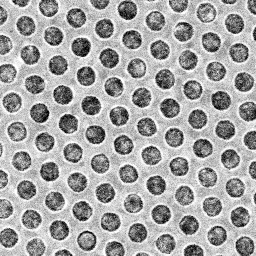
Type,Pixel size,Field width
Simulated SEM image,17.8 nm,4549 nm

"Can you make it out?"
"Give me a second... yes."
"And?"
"a regular array of holes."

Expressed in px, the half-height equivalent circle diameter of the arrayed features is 20.6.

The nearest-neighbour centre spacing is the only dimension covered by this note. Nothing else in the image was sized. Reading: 519 nm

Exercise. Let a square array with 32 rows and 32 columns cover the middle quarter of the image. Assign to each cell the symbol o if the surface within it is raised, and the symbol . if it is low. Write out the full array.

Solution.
.oooo.oooo...ooo.....oooooooo...
.oo....ooooooooo.....ooo..oooo..
ooo.....oooooooo....ooo....ooooo
ooo.....ooo...ooo...ooo.....oooo
oooo....oo.....oooooooo.....ooo.
ooooo..ooo.....oooooooo....ooo..
..oooooooo.....ooo...oooo.oooo..
..ooooooooo....oo.....oooooooo..
..ooo...ooooooooo.....oooo.oooo.
..oo.....oooooooo.....oo....oooo
oooo.....oooo.oooo...ooo.....ooo
ooooo....ooo....oooooooo.....ooo
o.ooo....oo.....oooooooo.....oo.
...oooooooo.....oooo..oooo.oooo.
....oooooooo....oo.....oooooooo.
....oo...oooo..ooo.....ooooooooo
...ooo....oooooooo.....ooo...ooo
o.ooo.....ooooooooo....oo.....oo
oooooo....ooo....oooooooo.....oo
oooooo....oo.....oooooooo.....oo
....oooooooo......ooo.oooo...ooo
.....oooooooo....oo.....oooooooo
.....ooo..oooo..ooo.....oooooooo
....ooo....oooooooo......oo...oo
o...ooo....ooooooooo....oo.....o
ooooooo....oooo..ooooooooo.....o
ooooooo....ooo....ooooooooo....o
oo...oooo.oooo.....oooooooo....o
o.....oooooooo.....oo....ooooooo
o.....ooooooooo...ooo....ooooooo
o.....oo....oooooooo......ooo..o
oo...ooo.....oooooooo....ooo....